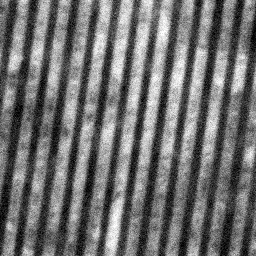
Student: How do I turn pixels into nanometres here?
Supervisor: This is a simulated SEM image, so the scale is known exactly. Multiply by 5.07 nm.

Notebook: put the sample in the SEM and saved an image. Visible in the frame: parallel lines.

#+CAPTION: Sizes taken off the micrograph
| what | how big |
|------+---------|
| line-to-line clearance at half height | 50.8 nm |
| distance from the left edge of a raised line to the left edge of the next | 0.103 microns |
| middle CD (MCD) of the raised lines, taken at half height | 50.8 nm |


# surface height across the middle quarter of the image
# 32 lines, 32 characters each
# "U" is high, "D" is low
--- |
DDUUDDDUUDDDUUUDDUUUDDUUUDDDUUDD
DDUUDDDUUDDDUUUDDUUUDDUUUDDDUUDD
DDUUDDDUUDDDUUDDDUUDDDUUDDDUUUDD
DDUUDDDUUDDDUUDDDUUDDDUUDDDUUUDD
DUUUDDUUUDDDUUDDDUUDDDUUDDDUUDDD
DUUUDDUUUDDDUUDDDUUDDDUUDDDUUDDD
DUUDDDUUUDDUUUDDUUUDDDUUDDDUUDDD
DUUDDDUUDDDUUDDDUUUDDUUUDDDUUDDD
DUUDDDUUDDDUUDDDUUUDDUUUDDUUUDDD
DUUDDDUUDDDUUDDDUUDDDUUDDDUUUDDU
UUUDDDUUDDDUUDDDUUDDDUUDDDUUUDDU
UUUDDUUUDDDUUDDDUUDDDUUDDDUUDDDU
UUUDDUUUDDDUUDDDUUDDDUUDDDUUDDDU
UUDDDUUDDDUUUDDUUUDDUUUDDDUUDDDU
UUDDDUUDDDUUUDDUUUDDUUUDDDUUDDDU
UUDDDUUDDDUUDDDUUUDDUUUDDUUUDDDU
UUDDDUUDDDUUDDDUUDDDUUDDDUUUDDUU
UUDDDUUDDDUUDDDUUDDDUUDDDUUUDDUU
UUDDUUUDDDUUDDDUUDDDUUDDDUUDDDUU
UUDDUUUDDUUUDDDUUDDDUUDDDUUDDDUU
UDDDUUDDDUUUDDUUUDDUUUDDDUUDDDUU
UDDDUUDDDUUUDDUUUDDUUUDDDUUDDDUU
UDDDUUDDDUUDDDUUDDDUUUDDUUUDDUUU
UDDDUUDDDUUDDDUUDDDUUDDDUUUDDUUU
UDDUUUDDDUUDDDUUDDDUUDDDUUUDDUUU
UDDUUUDDDUUDDDUUDDDUUDDDUUDDDUUD
UDDUUUDDUUUDDDUUDDDUUDDDUUDDDUUD
DDDUUDDDUUUDDUUUDDUUUDDDUUDDDUUD
DDDUUDDDUUUDDUUUDDUUUDDDUUDDDUUD
DDDUUDDDUUDDDUUDDDUUDDDUUUDDUUUD
DDDUUDDDUUDDDUUDDDUUDDDUUUDDUUUD
DDUUUDDDUUDDDUUDDDUUDDDUUDDDUUUD